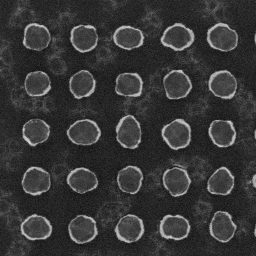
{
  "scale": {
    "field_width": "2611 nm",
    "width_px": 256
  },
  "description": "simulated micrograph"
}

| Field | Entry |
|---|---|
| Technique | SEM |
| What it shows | a regular array of raised bodies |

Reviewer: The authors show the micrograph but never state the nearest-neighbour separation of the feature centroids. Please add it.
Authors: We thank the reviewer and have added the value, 0.461 micrometres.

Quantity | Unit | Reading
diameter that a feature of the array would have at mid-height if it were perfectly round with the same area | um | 0.27